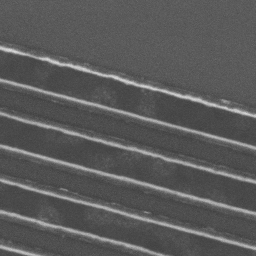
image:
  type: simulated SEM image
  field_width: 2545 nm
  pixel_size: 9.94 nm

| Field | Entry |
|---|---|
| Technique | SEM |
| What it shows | one or a few lines or trenches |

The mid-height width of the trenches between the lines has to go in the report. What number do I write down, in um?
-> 0.332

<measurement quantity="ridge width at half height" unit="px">30.7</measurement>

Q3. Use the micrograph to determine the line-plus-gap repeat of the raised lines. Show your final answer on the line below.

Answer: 636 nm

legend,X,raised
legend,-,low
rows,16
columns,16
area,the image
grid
----------------
----------------
----------------
XX--------------
XXXXXX----------
--XXXXXXX-------
------XXXXXXX---
X--------XXXXXXX
XXXXX--------XXX
-XXXXXXXX-------
-----XXXXXXXX---
X--------XXXXXXX
XXXXX--------XXX
-XXXXXXX--------
-----XXXXXXX----
---------XXXXXXX